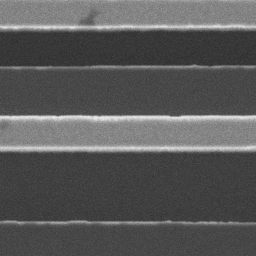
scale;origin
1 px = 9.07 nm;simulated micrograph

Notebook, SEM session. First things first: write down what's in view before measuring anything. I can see lines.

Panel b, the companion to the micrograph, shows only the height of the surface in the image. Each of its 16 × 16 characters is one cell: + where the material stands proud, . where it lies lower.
++++++++++++++++
++++++++++++++++
................
................
++++++++++++++++
++++++++++++++++
++++++++++++++++
++++++++++++++++
++++++++++++++++
................
................
................
................
................
++++++++++++++++
++++++++++++++++